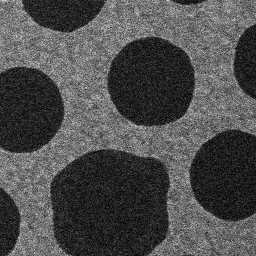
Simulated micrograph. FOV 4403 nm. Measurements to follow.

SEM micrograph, holes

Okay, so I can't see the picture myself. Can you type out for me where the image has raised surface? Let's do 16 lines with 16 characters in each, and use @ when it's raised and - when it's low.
@-----@@@@@@@@@@
@@---@@@@@@@@@@@
@@@@@@@@@@@@@@@-
@@@@@@@-----@@@-
---@@@@-----@@@-
----@@@-----@@@-
----@@@-----@@@@
----@@@@---@@@@@
---@@@@@@@@@@---
@-@@@@--@@@@----
@@@@------@@----
@@@--------@----
-@@-------@@----
-@@--------@@---
-@@-------@@@@@@
-@@@------@@@@@@